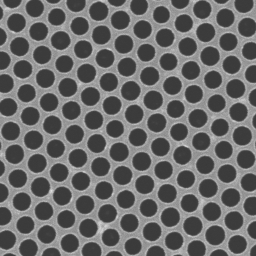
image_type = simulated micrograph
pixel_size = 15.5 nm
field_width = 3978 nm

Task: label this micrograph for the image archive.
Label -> a regular array of holes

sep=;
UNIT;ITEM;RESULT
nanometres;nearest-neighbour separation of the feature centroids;363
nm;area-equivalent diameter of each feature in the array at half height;296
